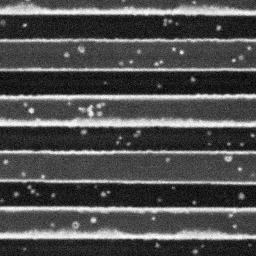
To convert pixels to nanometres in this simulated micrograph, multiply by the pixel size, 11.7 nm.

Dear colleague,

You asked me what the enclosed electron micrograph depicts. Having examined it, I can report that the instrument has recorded lines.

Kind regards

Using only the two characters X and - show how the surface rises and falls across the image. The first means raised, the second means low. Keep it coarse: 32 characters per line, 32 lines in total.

XXXXXXXXXXXXXXXXXXXXXXXXXXXXXXXX
XX--XXXXXXXXXXXXXXXXXXXXXXXXXXXX
--------------------------------
--------------------------------
--------------------------------
XXXXXXXXXXXXXXXXXXXXXXXXXXXXXXXX
XXXXXXXXXXXXXXXXXXXXXXXXXXXXXXXX
XXXXXXXXXXXXXXXXXXXXXXXXXXXXXXXX
XXXXXXXXXXXXXXXXXXXXXXXXXXXXXXXX
--------------------------------
--------------------------------
--------------------------------
XXXXXXXXXXXXXXXXXXXXXXXXXXXXXXXX
XXXXXXXXXXXXXXXXXXXXXXXXXXXXXXXX
XXXXXXXXXXXXXXXXXXXXXXXXXXXXXXXX
XXXXXXXXXX---XXXXXXX-XXXXXXXXXXX
--------------------------------
--------------------------------
--------------------------------
XXXXXXXXXXXXXXXXXXXXXXXXXXXXXXXX
XXXXXXXXXXXXXXXXXXXXXXXXXXXXXXXX
XXXXXXXXXXXXXXXXXXXXXXXXXXXXXXXX
XXXXXXXXXXXXXXXXXXXXXXXXXXXXXXXX
--------------------------------
--------------------------------
--------------------------------
XXXXXXXXXXXXXXXXXXXXXXXXXXXXXXXX
XXXXXXXXXXXXXXXXXXXXXXXXXXXXXXXX
XXXXXXXXXXXXXXXXXXXXXXXXXXXXXXXX
XXXXXXXXXXXXXXXXXXXXXXXXXXXXXXXX
--------------------------------
--------------------------------